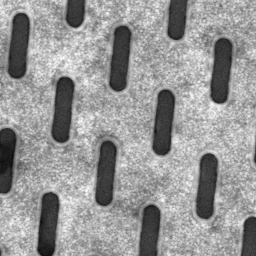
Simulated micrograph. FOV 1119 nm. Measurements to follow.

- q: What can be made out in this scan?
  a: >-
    holes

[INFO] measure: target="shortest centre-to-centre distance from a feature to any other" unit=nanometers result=335